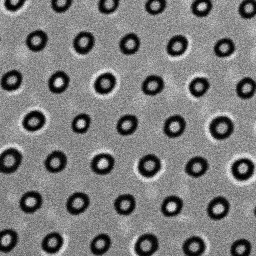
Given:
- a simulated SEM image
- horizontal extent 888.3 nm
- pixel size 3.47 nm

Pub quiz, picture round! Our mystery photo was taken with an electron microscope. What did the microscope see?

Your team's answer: a regular array of ring-shaped grooves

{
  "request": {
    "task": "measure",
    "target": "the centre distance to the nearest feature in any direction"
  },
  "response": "0.16 µm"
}